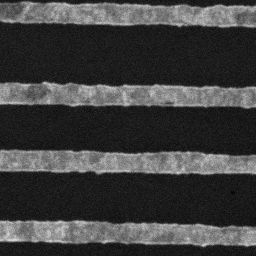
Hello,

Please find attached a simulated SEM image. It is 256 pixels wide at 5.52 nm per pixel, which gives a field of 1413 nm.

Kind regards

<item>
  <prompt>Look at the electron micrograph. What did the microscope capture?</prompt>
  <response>lines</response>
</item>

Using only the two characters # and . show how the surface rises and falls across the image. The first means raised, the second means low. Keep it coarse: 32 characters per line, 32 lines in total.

#####.##.....#..................
################################
################################
................................
................................
................................
................................
................................
................................
................................
###..##.........................
################################
################################
................................
................................
................................
................................
................................
................................
#############################..#
################################
..................##############
................................
................................
................................
................................
................................
................................
################################
################################
........................###.####
................................